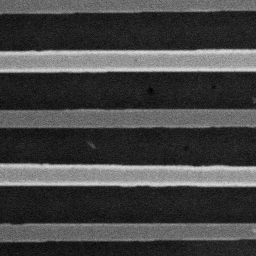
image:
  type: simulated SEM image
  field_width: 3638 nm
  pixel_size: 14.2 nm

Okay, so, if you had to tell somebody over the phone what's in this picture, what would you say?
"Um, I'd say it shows lines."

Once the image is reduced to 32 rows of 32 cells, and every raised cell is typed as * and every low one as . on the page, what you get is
********************************
*********.......................
................................
................................
................................
................................
********************************
********************************
********************************
................................
................................
................................
................................
................................
********************************
********************************
................................
................................
................................
................................
................................
********************************
********************************
................................
................................
................................
................................
................................
********************************
********************************
................................
................................